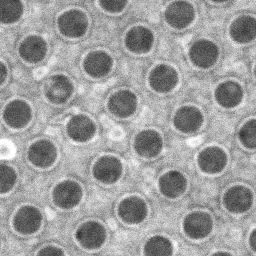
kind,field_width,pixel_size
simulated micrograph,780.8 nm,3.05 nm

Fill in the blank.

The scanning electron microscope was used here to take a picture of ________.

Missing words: a regular array of raised bodies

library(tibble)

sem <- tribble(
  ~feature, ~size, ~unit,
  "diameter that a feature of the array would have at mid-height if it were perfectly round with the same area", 102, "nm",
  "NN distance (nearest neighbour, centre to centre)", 0.143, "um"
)